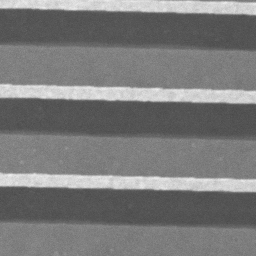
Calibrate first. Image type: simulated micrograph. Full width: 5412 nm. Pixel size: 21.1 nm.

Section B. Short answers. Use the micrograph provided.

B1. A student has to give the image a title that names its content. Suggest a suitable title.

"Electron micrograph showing lines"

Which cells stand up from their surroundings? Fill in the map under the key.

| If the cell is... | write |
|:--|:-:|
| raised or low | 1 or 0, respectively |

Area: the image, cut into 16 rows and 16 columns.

0011111111111111
0000000000000000
0000000000000000
1111111111111111
1111111111111111
1111111111111111
0000000000000000
0000000000000000
1111100000000000
1111111111111111
1111111111111111
1111111111111111
0000000000000000
0000000000000000
1111111111111111
1111111111111111